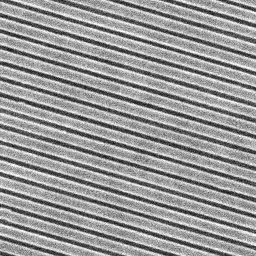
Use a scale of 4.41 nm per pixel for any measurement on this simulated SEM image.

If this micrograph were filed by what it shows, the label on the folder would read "parallel lines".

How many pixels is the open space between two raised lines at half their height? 5.76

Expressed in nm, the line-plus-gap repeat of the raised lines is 67.2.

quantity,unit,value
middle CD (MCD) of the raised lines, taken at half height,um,0.0429